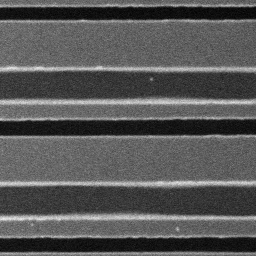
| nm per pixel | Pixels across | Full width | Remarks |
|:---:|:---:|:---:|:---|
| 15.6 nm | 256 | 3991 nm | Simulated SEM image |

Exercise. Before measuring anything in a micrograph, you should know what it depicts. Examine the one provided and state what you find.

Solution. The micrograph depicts lines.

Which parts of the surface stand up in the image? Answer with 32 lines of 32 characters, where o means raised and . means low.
oooooooooooooooooooooooooooooooo
................................
................................
oooooooooooooooooooooooooooooooo
oooooooooooooooooooooooooooooooo
oooooooooooooooooooooooooooooooo
oooooooooooooooooooooooooooooooo
oooooooooooooooooooooooooooooooo
oooooooooooooooooooooooooooooooo
................................
................................
................................
................................
oooooooooooooooooooooooooooooooo
oooooooooooooooooooooooooooooooo
................................
................................
oooooooooooooooooooooooooooooooo
oooooooooooooooooooooooooooooooo
oooooooooooooooooooooooooooooooo
oooooooooooooooooooooooooooooooo
oooooooooooooooooooooooooooooooo
oooooooooooooooooooooooooooooooo
................................
................................
................................
................................
oooooooooooooooooooooooooooooooo
oooooooooooooooooooooooooooooooo
oooooooooooooooooooooooooooooooo
................................
................................